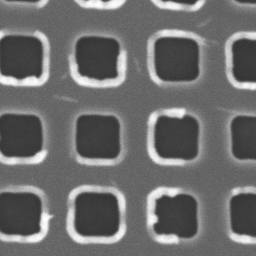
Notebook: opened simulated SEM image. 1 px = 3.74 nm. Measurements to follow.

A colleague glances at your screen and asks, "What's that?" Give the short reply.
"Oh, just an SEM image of holes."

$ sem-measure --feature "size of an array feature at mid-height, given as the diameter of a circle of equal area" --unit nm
180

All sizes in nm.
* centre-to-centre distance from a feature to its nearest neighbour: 292